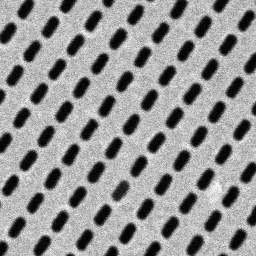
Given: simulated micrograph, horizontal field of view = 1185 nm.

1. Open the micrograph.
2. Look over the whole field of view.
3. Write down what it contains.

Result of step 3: a regular array of holes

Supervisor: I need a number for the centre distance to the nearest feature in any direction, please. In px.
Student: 30